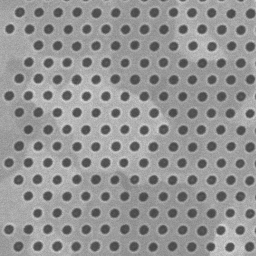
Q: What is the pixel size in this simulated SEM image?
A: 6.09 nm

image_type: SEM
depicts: a regular array of holes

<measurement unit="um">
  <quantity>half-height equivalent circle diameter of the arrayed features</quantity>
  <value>0.063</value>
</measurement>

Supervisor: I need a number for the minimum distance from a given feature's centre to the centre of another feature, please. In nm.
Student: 114